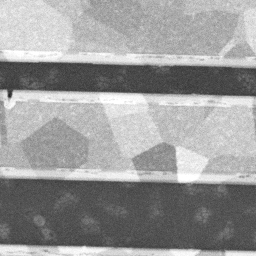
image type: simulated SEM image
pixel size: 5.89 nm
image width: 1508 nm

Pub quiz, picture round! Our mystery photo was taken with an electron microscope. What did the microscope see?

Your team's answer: one or a few lines or trenches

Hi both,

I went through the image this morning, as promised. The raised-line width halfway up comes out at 451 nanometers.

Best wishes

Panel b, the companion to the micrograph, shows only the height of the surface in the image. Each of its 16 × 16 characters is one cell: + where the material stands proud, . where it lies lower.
++++++++++++++++
++++++++++++++++
++++++++++++++++
.+++++++++++++++
................
................
++++++++++++++++
++++++++++++++++
++++++++++++++++
++++++++++++++++
++++++++++++++++
................
................
................
................
................